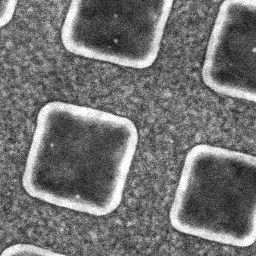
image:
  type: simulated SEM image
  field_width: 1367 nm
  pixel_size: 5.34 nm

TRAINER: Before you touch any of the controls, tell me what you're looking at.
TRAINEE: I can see raised bodies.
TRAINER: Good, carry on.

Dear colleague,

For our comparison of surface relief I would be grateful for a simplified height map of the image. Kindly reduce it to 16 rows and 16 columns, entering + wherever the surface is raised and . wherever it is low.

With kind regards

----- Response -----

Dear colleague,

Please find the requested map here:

+....+++++....++
....++++++....++
....++++++...+++
......++++...+++
.............+++
..............++
................
...++++.........
..++++++........
..++++++....++..
..++++++....++++
..++++++...+++++
...++++....+++++
...........+++++
............++++
.+..............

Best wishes